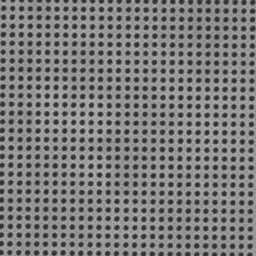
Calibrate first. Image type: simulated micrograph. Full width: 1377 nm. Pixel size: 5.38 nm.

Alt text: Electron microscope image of a regular array of holes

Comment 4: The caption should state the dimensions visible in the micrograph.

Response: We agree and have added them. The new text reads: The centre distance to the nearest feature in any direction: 45.8 nanometres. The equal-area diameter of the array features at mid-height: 29.7 nanometers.